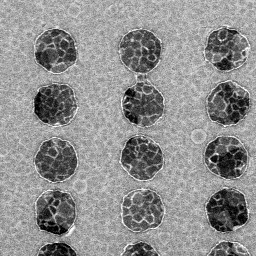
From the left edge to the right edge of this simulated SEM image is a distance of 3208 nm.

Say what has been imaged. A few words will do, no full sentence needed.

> a regular array of raised bodies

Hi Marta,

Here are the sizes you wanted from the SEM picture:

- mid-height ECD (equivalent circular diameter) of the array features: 544 nanometers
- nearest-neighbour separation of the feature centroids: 661 nm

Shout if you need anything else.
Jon